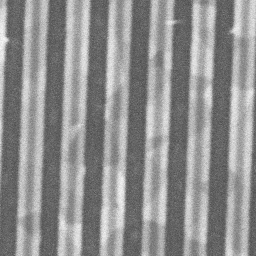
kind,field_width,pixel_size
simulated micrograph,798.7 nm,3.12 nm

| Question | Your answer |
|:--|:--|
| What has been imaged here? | parallel lines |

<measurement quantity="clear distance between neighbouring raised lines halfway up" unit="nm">76.7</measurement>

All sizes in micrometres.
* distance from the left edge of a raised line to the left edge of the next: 0.13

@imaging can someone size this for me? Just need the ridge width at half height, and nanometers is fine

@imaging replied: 52.9